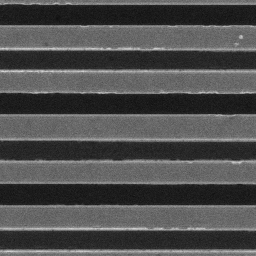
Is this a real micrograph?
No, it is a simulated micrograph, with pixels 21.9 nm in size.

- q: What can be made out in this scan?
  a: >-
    lines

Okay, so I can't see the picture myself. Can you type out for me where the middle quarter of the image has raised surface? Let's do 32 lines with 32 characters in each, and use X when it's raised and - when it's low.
--------------------------------
--------------------------------
XXXXXXXXXXXXXXXXXXXXXXXXXXXXXXXX
XXXXXXXXXXXXXXXXXXXXXXXXXXXXXXXX
XXXXXXXXXXXXXXXXXXXXXXXXXXXXXXXX
XXXXXXXXXXXXXXXXXXXXXXXXXXXXXXXX
XXXXXXXXXXXXXXXXXXXXXXXXXXXXXXXX
--------------------------------
--------------------------------
--------------------------------
--------------------------------
--------------------------------
--------------------------------
XXXXXXXXXXXXXXXXXXXXXXXXXXXXXXXX
XXXXXXXXXXXXXXXXXXXXXXXXXXXXXXXX
XXXXXXXXXXXXXXXXXXXXXXXXXXXXXXXX
XXXXXXXXXXXXXXXXXXXXXXXXXXXXXXXX
XXXXXXXXXXXXXXXXXXXXXXXXXXXXXXXX
XXXXXXXXXXXXXXXXXXXXXXXXXXXXXXXX
--------------------------------
--------------------------------
--------------------------------
--------------------------------
--------------------------------
------XX-XX----XXXXXXXXXXX------
XXXXXXXXXXXXXXXXXXXXXXXXXXXXXXXX
XXXXXXXXXXXXXXXXXXXXXXXXXXXXXXXX
XXXXXXXXXXXXXXXXXXXXXXXXXXXXXXXX
XXXXXXXXXXXXXXXXXXXXXXXXXXXXXXXX
XXXXXXXXXXXXXXXXXXXXXXXXXXXXXXXX
--------------------------------
--------------------------------